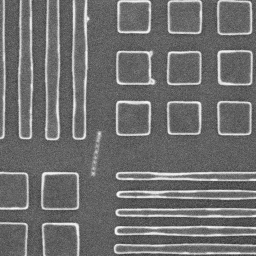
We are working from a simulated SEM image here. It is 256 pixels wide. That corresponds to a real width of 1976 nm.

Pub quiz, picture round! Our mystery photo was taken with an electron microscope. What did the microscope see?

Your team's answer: groups of lines, slits or small figures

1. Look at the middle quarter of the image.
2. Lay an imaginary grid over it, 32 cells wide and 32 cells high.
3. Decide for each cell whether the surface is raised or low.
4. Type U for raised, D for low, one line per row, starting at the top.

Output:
DDUUUUDDDDDDDUUUUUUUUDDDDDUUUUUU
DDUUUUDDDDDDDUUUUUUUUDDDDDUUUUUU
DDUUUUDDDDDDDUUUUUUUUDDDDDUUUUUU
DDUUUDDDDDDDDUUUUUUUUDDDDDUUUUUU
DDUUUDDDDDDDDUUUUUUUUDDDDDUUUUUU
DDUUUDDDDDDDDDDDDDDDDDDDDDDDDDDD
DDUUUDDDDDDDDDDDDDDDDDDDDDDDDDDD
DDUUUDDDDDDDDDDDDDDDDDDDDDDDDDDD
DDUUUDDDDDDDDDDDDDDDDDDDDDDDDDDD
DDDUUDDDDDDDDDDDDDDDDDDDDDDDDDDD
DDDUUDDDDDDDDUUUUUUUUDDDDDUUUUUU
DDUUUDDDDDDDDUUUUUUUUDDDDDUUUUUU
DDUUUDDDDDDDDUUUUUUUUDDDDDUUUUUU
DDUUUDDDDDDDDUUUUUUUUDDDDDUUUUUU
DDUUUDDDDDDDDUUUUUUUUDDDDDUUUUUU
DDUUUDDDDDDDDUUUUUUUUDDDDDUUUUUU
DDUUUDDDDDDDDUUUUUUUUDDDDDUUUUUU
DDUUUDDDDDDDDUUUUUUUUDDDDDDDDDDD
DDDUUDDDDDDDDDDDDDDDDDDDDDDDDDDD
DDDDDDDDDDDDDDDDDDDDDDDDDDDDDDDD
DDDDDDDDDDDDDDDDDDDDDDDDDDDDDDDD
DDDDDDDDDDDDDDDDDDDDDDDDDDDDDDDD
DDDDDDDDDDDDDDDDDDDDDDDDDDDDDDDD
DDDDDDDDDDDDDDDDDDDDDDDDDDDDDDDD
DDDDDDDDDDDDDDDDDDDDDDDDDDDDDDDD
DDDDDDDDDDDDDDDDDDDDDDDDDDDDDDDD
DDDDDDDDDDDDDDDDDDDDDDDDDDDDDDDD
UUUDDDDDDDDDDUUUUUUUUUUUDDDDDUUU
UUUDDDDDDDDDDUUUUUUUUUUUUUUUUUUU
UUUDDDDDDDDDDDDDDDDDDDDDDDDDDDDD
UUUDDDDDDDDDDDDDDDDDDDDDDDDDDDDD
UUUUDDDDDDDDDDDDDDDDDDDDDDDDDDDD